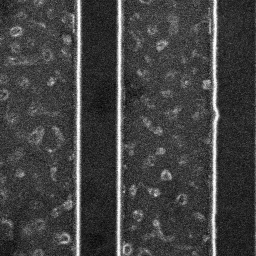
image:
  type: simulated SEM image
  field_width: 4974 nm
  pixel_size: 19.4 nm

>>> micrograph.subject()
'one or a few lines or trenches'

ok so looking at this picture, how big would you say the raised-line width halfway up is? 780 nanometres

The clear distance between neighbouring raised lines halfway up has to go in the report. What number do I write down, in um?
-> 1.86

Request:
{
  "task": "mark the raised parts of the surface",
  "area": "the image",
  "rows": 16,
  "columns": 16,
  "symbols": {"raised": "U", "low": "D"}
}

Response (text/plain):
DDDDDUUDDDDDDUUU
DDDDDUUDDDDDDUUU
DDDDDUUDDDDDDUUU
DDDDDUUDDDDDDUUU
DDDDDUUDDDDDDUUU
DDDDDUUDDDDDDUUU
DDDDDUUDDDDDDUUU
DDDDDUUDDDDDDUUU
DDDDDUUDDDDDDUUU
DDDDDUUDDDDDDUUU
DDDDDUUDDDDDDUUU
DDDDDUUDDDDDDUUU
DDDDDUUDDDDDDUUU
DDDDDUUDDDDDDUUU
DDDDDUUDDDDDDUUU
DDDDDUUDDDDDDUUU